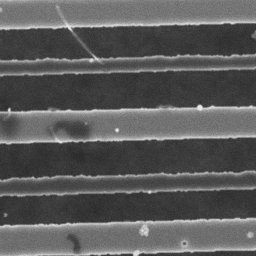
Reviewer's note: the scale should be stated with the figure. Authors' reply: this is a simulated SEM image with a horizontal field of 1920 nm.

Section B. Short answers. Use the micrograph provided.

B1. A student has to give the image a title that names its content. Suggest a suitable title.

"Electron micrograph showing lines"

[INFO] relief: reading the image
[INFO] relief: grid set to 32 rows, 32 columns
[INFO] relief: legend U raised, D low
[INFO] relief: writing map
UUUUUUUUUUUUUUUUUUUUUUUUUUUUUUUU
UUUUUUUUUUUUUUUUUUUUUUUUUUUUUUUU
UUUUUUUUUUUUUUUUUUUUUUUUUUUUUUUU
UUUUUDUDUDDDDDDDDDDDDDDDDDDDDDDD
DDDDDDDDDDDDDDDDDDDDDDDDDDDDDDDD
DDDDDDDDDDDDDDDDDDDDDDDDDDDDDDDD
DDDDDDDDDDDDDDDDDDDDDDDDDDDDDDDD
DDDDDUUUDDUUUUUUUUUUUUUUUUUUUUUU
UUUUUUUUUUUUUUUUUUUUUUUUUUUUUUUU
DDDDDDDDDDDDDDDDDDDDDDDDDDDDDDDD
DDDDDDDDDDDDDDDDDDDDDDDDDDDDDDDD
DDDDDDDDDDDDDDDDDDDDDDDDDDDDDDDD
DDDDDDDDDDDDDDDDDDDDDDDDDDDDDDDD
DDDDDDDDDDDDDDDDDDDDDDDDUUUUUUUU
UUUUUUUUUUUUUUUUUUUUUUUUUUUUUUUU
UUUUUUUUUUUUUUUUUUUUUUUUUUUUUUUU
UUUUUUUUUUUUUUUUUUUUUUUUUUUUUUUU
UUUUUUUUUUUUUUUUDDDDDDDDDDDDDDDD
DDDDDDDDDDDDDDDDDDDDDDDDDDDDDDDD
DDDDDDDDDDDDDDDDDDDDDDDDDDDDDDDD
DDDDDDDDDDDDDDDDDDDDDDDDDDDDDDDD
DDDDDDDDDDDDDDDDDDDDDDDDDDDDDDUU
DUUUUUUUUUUUUUUUUUUUUUUUUUUUUUUU
UUUUUUUUUUUUUUUUUUUUUUUUUUUUUUUU
DDDDDDDDDDDDDDDDDDDDDDDDDDDDDDDD
DDDDDDDDDDDDDDDDDDDDDDDDDDDDDDDD
DDDDDDDDDDDDDDDDDDDDDDDDDDDDDDDD
DDDDDDDDDDDDDDDDDDDDDDDDUUUUUUUU
UUUUUUUUUUUUUUUUUUUUUUUUUUUUUUUU
UUUUUUUUUUUUUUUUUUUUUUUUUUUUUUUU
UUUUUUUUUUUUUUUUUUUUUUUUUUUUUUUU
UUUUUUUUUUUUUUUUUUUUUUUUUDDDDDDD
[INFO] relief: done